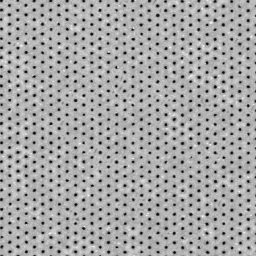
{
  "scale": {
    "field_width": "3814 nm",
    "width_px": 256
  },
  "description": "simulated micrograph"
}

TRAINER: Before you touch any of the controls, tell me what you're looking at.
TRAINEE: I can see a regular array of holes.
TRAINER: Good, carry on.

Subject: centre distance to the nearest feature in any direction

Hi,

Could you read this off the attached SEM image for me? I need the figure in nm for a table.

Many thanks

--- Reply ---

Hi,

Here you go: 136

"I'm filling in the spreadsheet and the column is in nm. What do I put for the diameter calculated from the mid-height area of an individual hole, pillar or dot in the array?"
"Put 44.5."